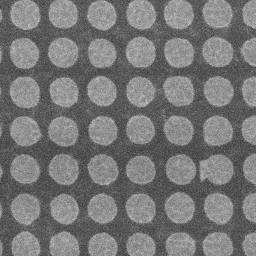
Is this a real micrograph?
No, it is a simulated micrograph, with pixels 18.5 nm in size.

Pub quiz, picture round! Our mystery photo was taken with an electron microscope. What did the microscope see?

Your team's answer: a regular array of raised bodies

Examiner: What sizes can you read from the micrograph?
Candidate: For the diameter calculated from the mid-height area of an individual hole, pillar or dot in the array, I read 0.529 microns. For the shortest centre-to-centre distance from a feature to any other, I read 704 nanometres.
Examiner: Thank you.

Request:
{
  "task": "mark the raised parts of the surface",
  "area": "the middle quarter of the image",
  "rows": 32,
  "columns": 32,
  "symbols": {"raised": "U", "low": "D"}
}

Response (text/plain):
UDDDDDDDUUUDDDDDDDUUUDDDDDDDUUDD
DDDDDDDDDDDDDDDDDDDDDDDDDDDDDDDD
DDDDDDDDDDDDDDDDDDDDDDDDDUDDDDDD
DDDDDDDDUUDDDDDDDDUUDDDDUUDUUUDD
UUDDDDDUUUUUDDDDDUUUUDDUUUUUUUUD
UUUDDDUUUUUUUDDDUUUUUUDUUUUUUUUU
UUUDDDUUUUUUUDDDUUUUUUUDDUUUUUUU
UUUDDDUUUUUUUDDDUUUUUUDDDUUUUUUU
UUUDDDDUUUUUUDDDUUUUUUDDDDUUUUUU
UUUDDDDDUUUUDDDDDUUUUDDDDDDUUUUU
UDDDDDDDDDDDDDDDDDDUDDDDDDDDDDDD
DDDDDDDDDDDDDDDDDDDDDDDDDDDDDDDD
DDDDDDDDDDDDDDDDDDDDDDDDDDDDDDDD
UDDDDDDDUUUDDDDDDUUUUDDDDDDUUUDD
UUDDDDDUUUUUDDDDUUUUUUDDDDUUUUUD
UUUDDDUUUUUUUDDDUUUUUUDDDUUUUUUU
UUUDDDUUUUUUUDDDUUUUUUDDDUUUUUUU
UUUDDDUUUUUUUDDDUUUUUUDDDUUUUUUU
UUUDDDDUUUUUUDDDDUUUUUDDDDUUUUUU
UUUDDDDDUUUUDDDDDDUUUDDDDDDUUUUD
DDDDDDDDDDDDDDDDDDDDDDDDDDDDDDDD
DDDDDDDDDDDDDDDDDDDDDDDDDDDDDDDD
DDDDDDDDDDDDDDDDDDDDDDDDDDDDDDDD
UUDDDDDUUUUUDDDDDDUUUDDDDDDUUUUD
UUUDDDDUUUUUUDDDUUUUUUDDDDUUUUUU
UUUDDDUUUUUUUDDDUUUUUUDDDDUUUUUU
UUUDDDUUUUUUUDDDUUUUUUUDDDUUUUUU
UUUDDDDUUUUUUDDDUUUUUUUDDDUUUUUU
UUUDDDDUUUUUUDDDUUUUUUDDDDUUUUUU
UUDDDDDDUUUUDDDDDDUUUDDDDDDUUUUD
DDDDDDDDDDDDDDDDDDDDDDDDDDDDDDDD
DDDDDDDDDDDDDDDUDDDDDDDDDDDDDDDD